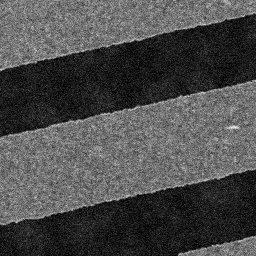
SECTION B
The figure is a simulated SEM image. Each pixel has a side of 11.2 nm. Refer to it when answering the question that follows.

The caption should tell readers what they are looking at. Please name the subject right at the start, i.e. one or a few lines or trenches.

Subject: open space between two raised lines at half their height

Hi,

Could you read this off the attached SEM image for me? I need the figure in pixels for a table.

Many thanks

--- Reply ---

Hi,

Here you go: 65.8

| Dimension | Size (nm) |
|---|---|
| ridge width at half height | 969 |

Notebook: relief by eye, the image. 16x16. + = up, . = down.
++++++++++++++++
+++++++++++++...
+++++++++.......
++++............
................
..............++
..........++++++
.....+++++++++++
++++++++++++++++
++++++++++++++++
++++++++++++++++
++++++++++++....
+++++++.........
+++.............
................
.............+++